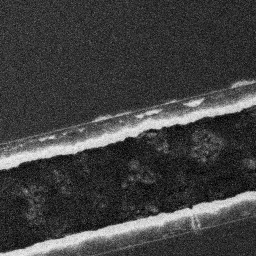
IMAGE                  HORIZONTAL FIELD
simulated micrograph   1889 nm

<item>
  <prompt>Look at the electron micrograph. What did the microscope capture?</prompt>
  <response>one or a few lines or trenches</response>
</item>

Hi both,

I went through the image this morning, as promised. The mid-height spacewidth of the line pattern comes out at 0.661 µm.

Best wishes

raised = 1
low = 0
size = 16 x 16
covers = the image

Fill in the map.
1111111111111111
1111111111111111
1111111111111111
1111111111111111
1111111111111111
1111111111111111
1111111111111110
1111111111110000
1111111000000000
1110000000000000
0000000000000000
0000000000000000
0000000000000001
0000000000011111
0000001111111111
0011111111111111